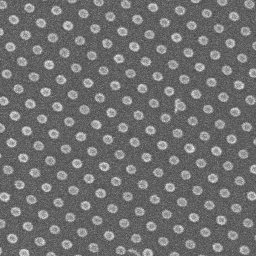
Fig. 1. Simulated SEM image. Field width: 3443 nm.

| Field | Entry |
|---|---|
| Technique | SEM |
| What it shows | a regular array of raised bodies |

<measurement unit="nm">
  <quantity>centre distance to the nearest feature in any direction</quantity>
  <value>254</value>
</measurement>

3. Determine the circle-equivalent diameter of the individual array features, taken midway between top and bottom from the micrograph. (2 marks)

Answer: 116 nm